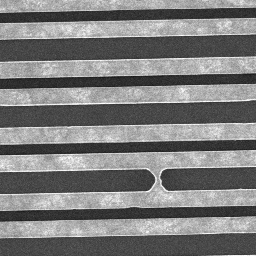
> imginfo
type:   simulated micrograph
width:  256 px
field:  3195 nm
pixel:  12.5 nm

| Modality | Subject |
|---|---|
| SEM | parallel lines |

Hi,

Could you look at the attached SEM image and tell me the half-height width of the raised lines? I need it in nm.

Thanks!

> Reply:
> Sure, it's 201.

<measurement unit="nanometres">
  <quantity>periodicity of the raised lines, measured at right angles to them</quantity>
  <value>412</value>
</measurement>